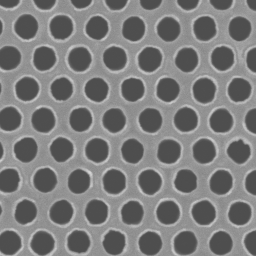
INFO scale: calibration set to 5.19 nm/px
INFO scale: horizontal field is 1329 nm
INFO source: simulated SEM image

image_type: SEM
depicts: a regular array of holes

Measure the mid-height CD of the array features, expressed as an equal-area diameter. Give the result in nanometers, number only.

119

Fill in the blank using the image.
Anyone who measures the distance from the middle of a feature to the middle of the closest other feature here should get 180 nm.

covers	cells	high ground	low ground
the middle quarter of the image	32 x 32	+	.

++....+++++....++++.....++++....
+++..+++++++++++++++...++++++...
++++++++++++++++++++++++++++++++
+++++++.+++++++++++++++++.++++++
..++++....+++++....+++++....++++
..+++......+++......+++......+++
..+++......+++......+++......+++
..+++......++++.....+++.....++++
.+++++....+++++....+++++....++++
+++++++++++++++++++++++++.++++++
++++++++++++++++++++++++++++++++
+++...+++++...++++++...++++++...
++.....+++.....++++.....++++....
++.....+++.....++++......+++....
+......+++.....++++......+++....
++....++++.....++++.....++++....
+++..++++++...++++++...++++++...
++++++++++++++++++++++++++++++++
++++++++++++++++++++++++++++++++
..++++....+++++....++++++...++++
..++++.....++++.....++++.....+++
..+++......+++......+++......+++
..++++.....++++.....+++......+++
.+++++.....++++....+++++.....+++
++++++++.+++++++..+++++++..+++++
++++++++++++++++++++++++++++++++
+++.++++++++.++++++++.+++++++..+
++....++++.....++++....+++++....
+.....++++.....++++.....++++....
+.....++++.....++++.....++++....
+.....++++.....++++.....++++....
++....++++.....+++++...++++++...